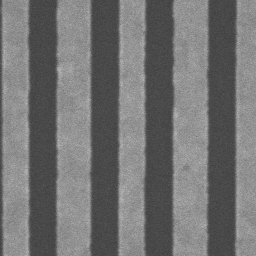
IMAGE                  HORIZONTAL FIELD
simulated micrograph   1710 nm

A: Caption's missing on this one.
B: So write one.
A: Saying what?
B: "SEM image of lines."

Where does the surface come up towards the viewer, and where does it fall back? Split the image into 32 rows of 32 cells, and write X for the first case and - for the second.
XXX----XXXX----XXX----XXXX----XX
XXX----XXXX----XXX----XXXX----XX
XXX----XXXX----XXX----XXXX----XX
XXX----XXXX----XXX----XXXX----XX
XXX----XXXX----XXX----XXXX----XX
XXX----XXXX----XXX----XXXX----XX
XXX----XXXX----XXX----XXXX----XX
XXX----XXXX----XXX----XXXX----XX
XXX----XXXX----XXX----XXXX----XX
XXXX---XXXX----XXX----XXXX----XX
XXXX---XXXX----XXX----XXXX----XX
XXX----XXXX----XXX----XXXX----XX
XXX----XXXX----XXX----XXXX----XX
XXX----XXXX----XXX----XXXX----XX
XXX----XXXX----XXX----XXXX----XX
XXX----XXXX----XXX----XXXX----XX
XXXX---XXXX----XXX----XXXX----XX
XXX----XXXX----XXX----XXXX----XX
XXX----XXXX----XXX----XXXX----XX
XXX----XXXX----XXX----XXXX----XX
XXX----XXXX----XXX----XXXX----XX
XXX----XXXX----XXX----XXXX----XX
XXX----XXXX----XXX----XXXX----XX
XXXX---XXXX----XXX----XXXX----XX
XXX----XXXX----XXX----XXXX----XX
XXX----XXXX----XXX----XXXX----XX
XXXX---XXXX----XXX----XXXX----XX
XXX----XXXX----XXX----XXXX----XX
XXX----XXXX----XXX----XXXX----XX
XXXX---XXXX----XXX----XXXX----XX
XXX----XXXX----XXX----XXXX----XX
XXXX---XXXX----XXX----XXXX----XX